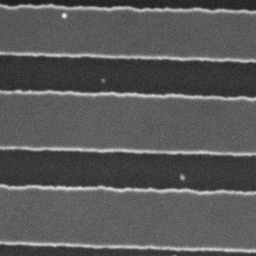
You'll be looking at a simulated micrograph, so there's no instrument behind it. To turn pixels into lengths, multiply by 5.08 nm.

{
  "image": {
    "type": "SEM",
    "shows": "lines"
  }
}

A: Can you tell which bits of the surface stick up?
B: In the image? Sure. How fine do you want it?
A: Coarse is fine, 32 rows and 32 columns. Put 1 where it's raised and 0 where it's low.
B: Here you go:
00000000000000000000000000000000
11111111111111111111111111111111
11111111111111111111111111111111
11111111111111111111111111111111
11111111111111111111111111111111
11111111111111111111111111111111
11111111111111111111111111111111
00000000000000000000001101111111
00000000000000000000000000000000
00000000000000000000000000000000
00000000000000000000000000000000
11111111100000000000000000000000
11111111111111111111111111111111
11111111111111111111111111111111
11111111111111111111111111111111
11111111111111111111111111111111
11111111111111111111111111111111
11111111111111111111111111111111
11111111111111111111111111111111
00000000000000000000000000000000
00000000000000000000000000000000
00000000000000000000000000000000
00000000000000000000000000000000
11111111111111000000000000000000
11111111111111111111111111111111
11111111111111111111111111111111
11111111111111111111111111111111
11111111111111111111111111111111
11111111111111111111111111111111
11111111111111111111111111111111
11111111111111111111111111111111
00000000000000000000000000000000